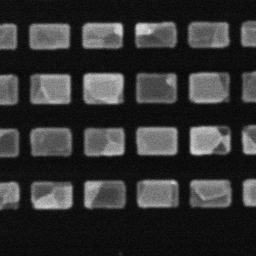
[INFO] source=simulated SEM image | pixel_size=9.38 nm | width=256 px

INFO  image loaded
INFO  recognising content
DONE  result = wiring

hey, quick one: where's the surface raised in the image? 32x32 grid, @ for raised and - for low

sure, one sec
--------------------------------
--------------------------------
--------------------------------
@---@@@@---@@@@--@@@@@--@@@@---@
@@--@@@@---@@@@--@@@@@--@@@@---@
@@--@@@@---@@@@---@@@---@@@@----
--------------------------------
--------------------------------
--------------------------------
------------------------@@@@---@
@@--@@@@---@@@@--@@@@@--@@@@---@
@@--@@@@---@@@@--@@@@@--@@@@---@
@@--@@@@---@@@@-----------------
--------------------------------
--------------------------------
--------------------------------
-@---@@@---@@@@---@@@@--@@@@---@
@@--@@@@@--@@@@--@@@@@--@@@@---@
@@--@@@@@--@@@@--@@@@@--@@@@---@
--------------------------------
--------------------------------
--------------------------------
--------------------------------
@@--@@@@@--@@@@---@@@@--@@@@---@
@@--@@@@@--@@@@---@@@@--@@@@---@
@@---@@@---@@@@---@@@@---@@@---@
--------------------------------
--------------------------------
--------------------------------
--------------------------------
--------------------------------
--------------------------------